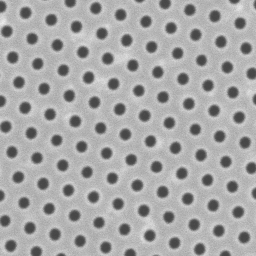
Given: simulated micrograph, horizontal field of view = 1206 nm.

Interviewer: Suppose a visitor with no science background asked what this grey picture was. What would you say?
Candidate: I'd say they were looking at a regular array of holes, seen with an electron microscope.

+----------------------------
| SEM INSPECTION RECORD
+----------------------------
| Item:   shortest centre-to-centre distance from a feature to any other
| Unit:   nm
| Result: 121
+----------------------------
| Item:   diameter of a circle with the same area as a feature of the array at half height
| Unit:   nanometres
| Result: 57.6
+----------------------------